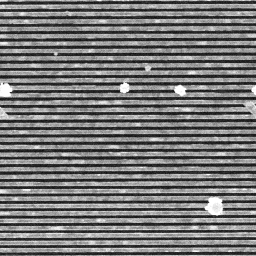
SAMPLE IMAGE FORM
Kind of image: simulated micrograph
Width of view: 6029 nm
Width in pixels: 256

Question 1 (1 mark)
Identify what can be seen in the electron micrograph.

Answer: parallel lines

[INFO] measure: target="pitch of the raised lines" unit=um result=0.174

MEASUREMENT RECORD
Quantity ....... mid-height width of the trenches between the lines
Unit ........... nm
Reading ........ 88.3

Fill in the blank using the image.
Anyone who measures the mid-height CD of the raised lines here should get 88.3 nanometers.